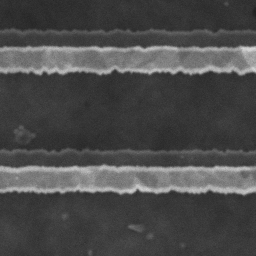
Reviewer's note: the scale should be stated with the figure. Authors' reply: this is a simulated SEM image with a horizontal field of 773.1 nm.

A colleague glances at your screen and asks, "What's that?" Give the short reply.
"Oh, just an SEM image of lines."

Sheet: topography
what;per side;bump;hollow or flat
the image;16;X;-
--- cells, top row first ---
----------------
----------------
XXXXXXXXXXXXXXXX
XXXXXXXXXXXXXXXX
XXXXXXX-XXXXX-XX
----------------
----------------
----------------
----------------
XXXXXXXXXXXXXXXX
XXXXXXXXXXXXXXXX
XXXXXXXXXXXXXXXX
----------------
----------------
----------------
----------------